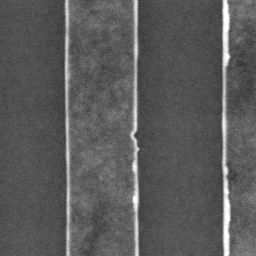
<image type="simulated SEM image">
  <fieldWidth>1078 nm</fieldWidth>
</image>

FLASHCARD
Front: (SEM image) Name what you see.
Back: one or a few lines or trenches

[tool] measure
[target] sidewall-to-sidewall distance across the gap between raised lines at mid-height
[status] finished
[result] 368 nm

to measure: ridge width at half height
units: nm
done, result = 296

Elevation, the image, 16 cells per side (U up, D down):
DDDDUUUUUDDDDDUU
DDDDUUUUUDDDDDUU
DDDDUUUUUDDDDDUU
DDDDUUUUUDDDDDUU
DDDDUUUUDDDDDDUU
DDDDUUUUDDDDDDUU
DDDDUUUUDDDDDDUU
DDDDUUUUDDDDDDUU
DDDDUUUUDDDDDDUU
DDDDUUUUUDDDDDUU
DDDDUUUUUDDDDDUU
DDDDUUUUUDDDDDUU
DDDDUUUUUDDDDDUU
DDDDUUUUUDDDDDUU
DDDDUUUUUDDDDDUU
DDDDUUUUUDDDDDUU